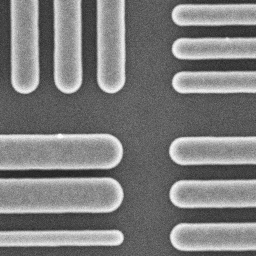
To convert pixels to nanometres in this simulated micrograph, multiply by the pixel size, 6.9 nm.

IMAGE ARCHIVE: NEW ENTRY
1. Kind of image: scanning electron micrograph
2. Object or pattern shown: groups of lines, slits or small figures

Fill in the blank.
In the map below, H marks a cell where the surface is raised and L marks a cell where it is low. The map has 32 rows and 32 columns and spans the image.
LHHHHLLHHHLLHHHLLLLLLLLLLLLLLLLL
LHHHHLLHHHLLHHHLLLLLLLHHHHHHHHHH
LLHHHLLHHHLLHHHLLLLLLLHHHHHHHHHH
LLHHHLLHHHLLHHHLLLLLLLLLLLLLLLLL
LLHHHLLHHHLLHHHLLLLLLLLLLLLLLLLL
LLHHHLLHHHLLHHHLLLLLLLHHHHHHHHHH
LLHHHLLHHHLLHHHLLLLLLLHHHHHHHHHH
LLHHHLLHHHLLHHHLLLLLLLLLLLLLLLLL
LLHHHLLHHHLLHHHLLLLLLLLLLLLLLLLL
LLHHHLLHHHLLHHHLLLLLLLHHHHHHHHHH
LLHHHLLHHHLLHHHLLLLLLLHHHHHHHHHH
LLLHLLLLHLLLLLLLLLLLLLLHLHLHHLLL
LLLLLLLLLLLLLLLLLLLLLLLLLLLLLLLL
LLLLLLLLLLLLLLLLLLLLLLLLLLLLLLLL
LLLLLLLLLLLLLLLLLLLLLLLLLLLLLLLL
LLLLLLLLLLLLLLLLLLLLLLLLLLLLLLLL
LLLLLLLLLLLLLLLLLLLLLLLLLLLLLLLL
HHHHHHHHHHHHHHHLLLLLLLHHHHHHHHHH
HHHHHHHHHHHHHHHLLLLLLHHHHHHHHHHH
HHHHHHHHHHHHHHHLLLLLLHHHHHHHHHHH
HHHHHHHHHHHHHHHLLLLLLLLLLLLLLLLL
LLLLLLLLLLLLLLLLLLLLLLLLLLLLLLLL
HHHHHHHHHHHHHHLLLLLLLLLLLLLLLLLL
HHHHHHHHHHHHHHHLLLLLLLHHHHHHHHHH
HHHHHHHHHHHHHHHLLLLLLHHHHHHHHHHH
HHHHHHHHHHHHHHHLLLLLLLHHHHHHHHHH
HHHHLLLLLLLLLLLLLLLLLLLLLLLLLLLL
LLLLLLLLLLLLLLLLLLLLLLLLLLLLLLLL
LLLLLLLLLLLLLLLLLLLLLLHHHHHHHHHH
HHHHHHHHHHHHHHHLLLLLLHHHHHHHHHHH
HHHHHHHHHHHHHHHLLLLLLLHHHHHHHHHH
LLLLLLLLLLLLLLLLLLLLLLLLLLLLLLLL